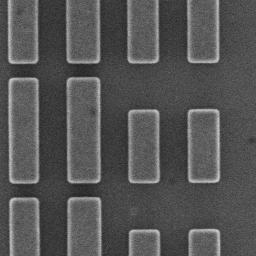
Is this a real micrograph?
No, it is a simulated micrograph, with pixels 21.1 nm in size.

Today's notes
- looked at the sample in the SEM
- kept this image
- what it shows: wiring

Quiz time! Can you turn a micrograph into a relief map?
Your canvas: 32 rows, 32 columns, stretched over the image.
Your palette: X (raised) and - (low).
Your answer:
-XXXX---XXXX----XXXX----XXX-----
-XXXX---XXXX----XXXX----XXX-----
-XXXX---XXXX----XXXX----XXX-----
-XXXX---XXXX----XXXX----XXX-----
-XXXX---XXXX----XXXX----XXX-----
-XXXX---XXXX----XXXX----XXX-----
-XXXX---XXXX----XXXX----XXX-----
-XXXX----XXX----XXXX----XXX-----
--------------------------------
--------------------------------
-XXXX---XXXX--------------------
-XXXX---XXXX--------------------
-XXXX---XXXX--------------------
-XXXX---XXXX--------------------
-XXXX---XXXX----XXXX----XXX-----
-XXXX---XXXX----XXXX----XXX-----
-XXXX----XXX----XXXX----XXX-----
-XXXX----XXX----XXXX----XXX-----
-XXXX----XXX----XXXX----XXX-----
-XXXX----XXXX---XXXX----XXX-----
-XXXX----XXXX---XXXX----XXX-----
-XXXX----XXXX---XXXX----XXX-----
-XXXX----XXX----XXXX----XXX-----
--------------------------------
--------------------------------
-XXXX----XXXX-------------------
-XXXX----XXXX-------------------
-XXXX----XXXX-------------------
-XXXX----XXXX-------------------
-XXXX----XXXX---XXXX----XXX-----
-XXXX----XXXX---XXXX----XXX-----
-XXXX----XXXX---XXXX----XXX-----